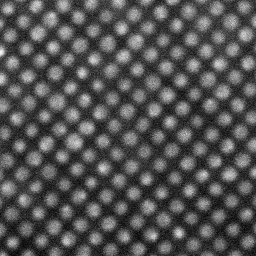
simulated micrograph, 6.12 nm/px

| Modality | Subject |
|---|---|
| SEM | a regular array of raised bodies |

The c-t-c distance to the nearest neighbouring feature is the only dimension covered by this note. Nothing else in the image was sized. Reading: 116 nm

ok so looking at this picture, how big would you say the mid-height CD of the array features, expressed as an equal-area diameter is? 70.9 nm